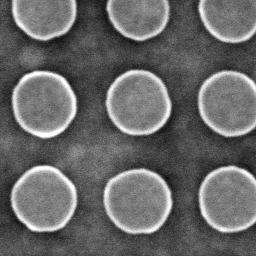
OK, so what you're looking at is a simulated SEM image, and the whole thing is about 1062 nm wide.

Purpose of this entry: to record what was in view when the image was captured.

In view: raised bodies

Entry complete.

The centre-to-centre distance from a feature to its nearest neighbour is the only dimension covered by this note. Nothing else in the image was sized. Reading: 0.391 µm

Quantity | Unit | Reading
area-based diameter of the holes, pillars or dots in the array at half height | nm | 262